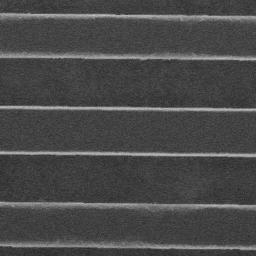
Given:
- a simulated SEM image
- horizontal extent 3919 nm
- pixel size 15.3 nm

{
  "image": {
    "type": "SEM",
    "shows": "lines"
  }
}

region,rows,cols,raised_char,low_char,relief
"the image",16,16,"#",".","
................
################
################
..##############
................
................
................
################
################
################
................
................
................
################
################
.............###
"